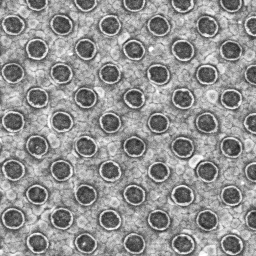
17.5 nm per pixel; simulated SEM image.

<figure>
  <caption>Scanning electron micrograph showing a regular array of raised bodies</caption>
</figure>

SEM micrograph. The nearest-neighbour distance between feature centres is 0.594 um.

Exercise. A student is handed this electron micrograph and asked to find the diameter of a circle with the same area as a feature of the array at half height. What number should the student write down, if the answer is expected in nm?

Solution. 354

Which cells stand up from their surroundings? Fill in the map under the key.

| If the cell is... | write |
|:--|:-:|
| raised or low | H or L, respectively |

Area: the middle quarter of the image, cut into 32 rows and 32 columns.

HLLLLLLLLLHHHLLLLLLLLLHHHLLLLLLL
HHLLLLLLLHHHHHLLLLLLLHHHHHLLLLLL
HHLLLLLLLHHHHHLLLLLLLHHHHHLLLLLL
HHLLLLLLLHHHHHLLLLLLLHHHHHLLLLLL
LLLLLLLLLLHHHLLLLLLLLLHHHHLLLLLL
LLLLLLLLLLLLLLLLLLLLLLLLLLLLLLLL
LLLLHHHLHLLLLLLLLHLLLLLLLLLLHHHL
LLLHHHHHLHLLLLLHHHHHLLLLLLLHHHHH
LLLHHHHHLLLLLLLHHHHHLLLLLLLHHHHH
LLLHHHHHLLLLLLLHHHHHLLLLLLLHHHHH
LLLLHHHLLLLLLLLLHHHLLLLLLLLLHHHH
LLLLLLLLLLLLLLLLLLLLLLLLLLLLLLLL
HLLLLLLLLLHHLLLLLLLLLLLHLLLLLLLL
HHLLLLLLLHHHHHLLLLLLLLHHHHLLLLLL
HHLLLLLLLHHHHHLLLLLLLHHHHHLLLLLL
HHLLLLLLLHHHHHLLLLLLLHHHHHLLLLLL
HLLLLLLLLLHHHLLLLLLLLLHHHLLLLLLL
LLLLLLLLLLLLLLLLLLLLLLLLLLLLLLLL
LLLLHHHLLLLLLLLLLHLLLLLLLLLLLHLL
LLLHHHHHLLLLLLLHHHHHLLLLLLLHHHHH
LLLHHHHHLLLLLLLHHHHHLLLLLLLHHHHH
LLLHHHHHLLLLLLLHHHHHLLLLLLLHHHHH
LLLLHHHHLLLLLLLLHHHHLLLLLLLLHHHH
LLLLLLLLLLLLLLLLLLLLLLLLLLLLLLLL
LLLLLLLLLLHHLLLLLLLLLLLLLLLLLLLL
HHLLLLLLLHHHHHLLLLLLLLHHHHLLLLLL
HHLLLLLLLHHHHHLLLLLLLHHHHHLLLLLL
HHLLLLLLLHHHHHLLLLLLLHHHHHLLLLLH
HLLLLLLLLLHHHHLLLLLLLLHHHHLLLLLL
LLLLLLLLLLLLLLLLLLLLLLLLLLLLLLLL
LLLLHHLLLLLLLLLLLHLLLLLLLLLLLHLL
LLLHHHHHLLLLLLLHHHHHLLLLLLLHHHHH